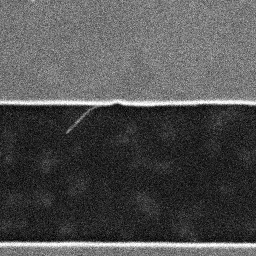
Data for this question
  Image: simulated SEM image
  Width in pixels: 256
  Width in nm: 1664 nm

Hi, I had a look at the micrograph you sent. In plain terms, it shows one or a few lines or trenches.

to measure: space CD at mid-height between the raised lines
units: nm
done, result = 916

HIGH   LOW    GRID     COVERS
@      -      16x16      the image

@@@@@@@@@@@@@@@@
@@@@@@@@@@@@@@@@
@@@@@@@@@@@@@@@@
@@@@@@@@@@@@@@@@
@@@@@@@@@@@@@@@@
@@@@@@@@@@@@@@@@
----------------
----------------
----------------
----------------
----------------
----------------
----------------
----------------
----------------
@@@@@@@@@@@@@@@@